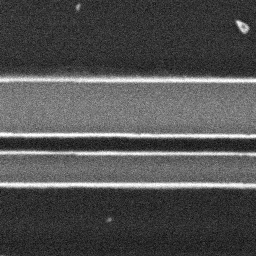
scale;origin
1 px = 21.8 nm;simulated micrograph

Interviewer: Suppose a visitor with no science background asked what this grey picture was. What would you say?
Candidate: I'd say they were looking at lines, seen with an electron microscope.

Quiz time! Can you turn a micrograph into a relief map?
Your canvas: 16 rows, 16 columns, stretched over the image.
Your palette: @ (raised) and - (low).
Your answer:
@@@@@@@@@@@@@@@@
@@@@@@@@@@@@@@@@
@@@@@@@@@@@@@@@@
@@@@@@@@@@@@@@@@
@@@@@@@@@@@@@@@@
----------------
----------------
----------------
@@@@@@@@@@@@----
@@@@@@@@@@@@@@@@
----------------
----------------
@@@@@@@@@@@@@@@@
@@@@@@@@@@@@@@@@
@@@@@@@@@@@@@@@@
@@@@@@@@@@@@@@@@